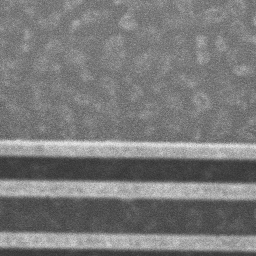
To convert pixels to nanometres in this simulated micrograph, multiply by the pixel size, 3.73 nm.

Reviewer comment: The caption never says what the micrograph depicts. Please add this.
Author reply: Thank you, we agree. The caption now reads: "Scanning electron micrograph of parallel lines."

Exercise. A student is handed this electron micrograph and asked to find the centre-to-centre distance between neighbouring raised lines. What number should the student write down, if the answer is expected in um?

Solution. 0.171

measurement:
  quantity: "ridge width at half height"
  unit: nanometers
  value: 52.2